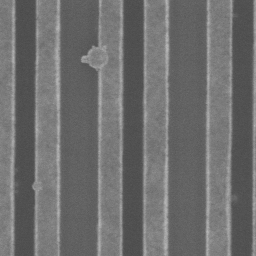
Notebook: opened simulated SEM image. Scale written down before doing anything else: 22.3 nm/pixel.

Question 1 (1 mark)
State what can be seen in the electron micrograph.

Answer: lines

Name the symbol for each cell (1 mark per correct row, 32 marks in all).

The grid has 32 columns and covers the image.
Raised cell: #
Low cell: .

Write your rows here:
##...##.....###...###.....###...
##...##.....###...###.....###...
##...##.....###...###.....###...
##...##.....###...###.....###...
##...##.....###...###.....###...
##...##.....###...###.....###...
##...##....####...###.....###...
##...##...#####...###.....###...
##...##.....###...###.....###...
##...##.....###...###.....###...
##...##.....###...###.....###...
##...##.....###...###.....###...
##...##.....###...###.....###...
##...##.....###...###.....###...
##...##.....###...###.....###...
##...##.....###...###.....###...
##...##.....###...###.....###...
##..###.....###...###.....###...
##..###.....###...###.....###...
##..###.....###...###.....###...
##..###.....###...###.....###...
##..###.....###...###.....###...
##..###.....###...###.....###...
##..###.....###...###.....###...
##..###.....###...###.....###...
##..###.....###...###.....###...
##..###.....###...###.....###...
##..###.....###...###.....###...
##..###.....###...###.....###...
##..###.....###...###.....###...
##..###.....###...###.....###...
##..###.....###...###.....###...